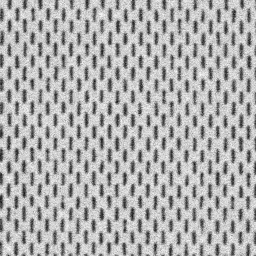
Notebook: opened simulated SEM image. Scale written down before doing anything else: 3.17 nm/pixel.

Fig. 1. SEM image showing a regular array of holes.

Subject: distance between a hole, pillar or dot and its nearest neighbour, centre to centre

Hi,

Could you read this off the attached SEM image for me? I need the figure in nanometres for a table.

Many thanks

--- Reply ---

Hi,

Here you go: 42.4